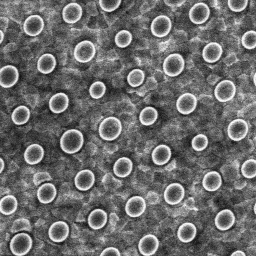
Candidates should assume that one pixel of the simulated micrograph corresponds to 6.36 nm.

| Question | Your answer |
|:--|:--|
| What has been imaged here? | a regular array of raised bodies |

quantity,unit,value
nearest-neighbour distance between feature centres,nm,255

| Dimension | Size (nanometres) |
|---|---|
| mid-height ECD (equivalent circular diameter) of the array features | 119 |